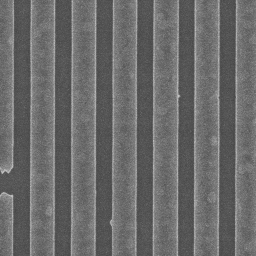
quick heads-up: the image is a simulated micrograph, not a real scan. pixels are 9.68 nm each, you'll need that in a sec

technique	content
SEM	parallel lines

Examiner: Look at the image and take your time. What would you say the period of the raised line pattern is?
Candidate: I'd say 397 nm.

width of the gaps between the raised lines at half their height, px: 16.8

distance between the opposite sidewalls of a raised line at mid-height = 234 nm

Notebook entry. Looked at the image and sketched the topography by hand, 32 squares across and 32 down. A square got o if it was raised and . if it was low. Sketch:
oo..ooo..ooo..ooo..ooo..ooo...oo
oo..ooo..ooo..ooo..ooo..ooo...oo
oo..ooo..ooo..ooo..ooo..ooo...oo
oo..ooo..ooo..ooo..ooo..ooo...oo
oo..ooo..ooo..ooo..ooo..ooo...oo
oo..ooo..ooo..ooo..ooo..ooo...oo
oo..ooo..ooo..ooo..ooo..ooo...oo
oo..ooo..ooo..ooo..ooo..ooo...oo
oo..ooo..ooo..ooo..ooo..ooo...oo
oo..ooo..ooo..ooo..ooo..ooo...oo
oo..ooo..ooo..ooo..ooo..ooo...oo
oo..ooo..ooo..ooo..ooo..ooo...oo
oo..ooo..ooo..ooo..ooo..ooo...oo
oo..ooo..ooo..ooo..ooo..ooo...oo
oo..ooo..ooo..ooo..ooo..ooo...oo
oo..ooo..ooo..ooo..ooo..ooo...oo
oo..ooo..ooo..ooo..ooo..ooo...oo
oo..ooo..ooo..ooo..ooo..ooo...oo
oo..ooo..ooo..ooo..ooo..ooo...oo
oo..ooo..ooo..ooo..ooo..ooo...oo
oo..ooo..ooo..ooo..ooo..ooo...oo
....ooo..ooo..ooo..ooo..ooo...oo
....ooo..ooo..ooo..ooo..ooo...oo
....ooo..ooo..ooo..ooo..ooo...oo
o...ooo..ooo..ooo..ooo..ooo...oo
oo..ooo..ooo..ooo..ooo..ooo...oo
oo..ooo..ooo..ooo..ooo..ooo..ooo
oo..ooo..ooo..ooo..ooo..ooo..ooo
oo..ooo..ooo..ooo..ooo..ooo..ooo
oo..ooo..ooo..ooo..ooo..ooo..ooo
oo..ooo..ooo..ooo..ooo..ooo..ooo
oo..ooo..ooo..ooo..ooo..ooo..ooo